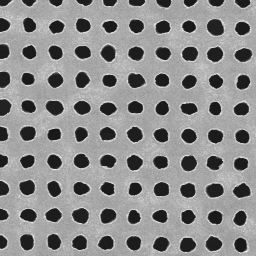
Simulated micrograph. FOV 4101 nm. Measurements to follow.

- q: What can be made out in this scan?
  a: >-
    a regular array of holes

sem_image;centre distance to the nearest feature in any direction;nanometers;421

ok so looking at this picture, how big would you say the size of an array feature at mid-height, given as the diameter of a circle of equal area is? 226 nm